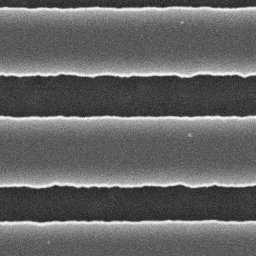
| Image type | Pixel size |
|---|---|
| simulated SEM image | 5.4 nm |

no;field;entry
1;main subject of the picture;lines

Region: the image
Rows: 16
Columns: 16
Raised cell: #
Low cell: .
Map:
......#...###..#
################
################
################
################
................
................
################
################
################
################
################
................
................
################
################